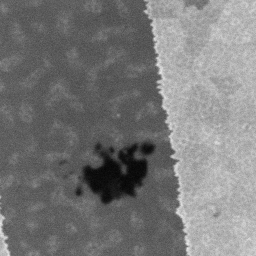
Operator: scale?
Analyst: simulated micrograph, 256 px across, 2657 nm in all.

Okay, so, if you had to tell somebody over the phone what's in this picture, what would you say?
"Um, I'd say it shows one or a few lines or trenches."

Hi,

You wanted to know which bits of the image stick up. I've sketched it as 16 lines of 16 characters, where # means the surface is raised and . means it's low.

.........#######
..........######
..........######
..........######
..........######
..........######
..........######
...........#####
...........#####
...........#####
...........#####
...........#####
...........#####
...........#####
............####
............####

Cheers